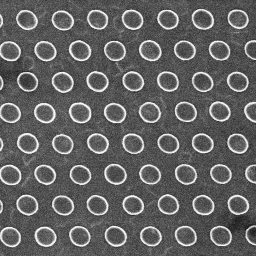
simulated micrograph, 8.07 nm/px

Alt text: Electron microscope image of a regular array of raised bodies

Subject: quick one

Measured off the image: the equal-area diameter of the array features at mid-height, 160 nanometers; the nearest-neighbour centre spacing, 281 nm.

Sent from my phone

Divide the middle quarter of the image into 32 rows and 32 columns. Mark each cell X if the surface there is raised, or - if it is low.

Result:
--------------------------------
--------------------------------
X------XXX------XX------XXXX----
XX----XXXXX----XXXX----XXXXX----
XX----XXXXX----XXXXX----XXXX----
XX----XXXXX----XXXXX----XXXX----
X------XXX-------X-------XX-----
--------------------------------
--------------------------------
--------------------------------
--XXX------XXX-----XXXX-----XXXX
--XXXX----XXXXX----XXXXX----XXXX
--XXXXX---XXXXX----XXXXX----XXXX
--XXXX-----XXXX-----XXXX-----XXX
-------------X------------------
--------------------------------
--------------------------------
--------------------------------
XX----XXXX-----XXXX-----XXXX----
XX----XXXXX----XXXXX----XXXX----
XX----XXXXX----XXXXX----XXXXX---
XX-----XXX------XXX-----XXXX----
--------------------------------
--------------------------------
--------------------------------
---XX------XXX------XX-------XX-
--XXXX----XXXXX----XXXXX----XXXX
--XXXX----XXXXX----XXXXX----XXXX
--XXXX-----XXXX----XXXXX----XXXX
---XXX------XXX-----XXX------XXX
--------------------------------
--------------------------------